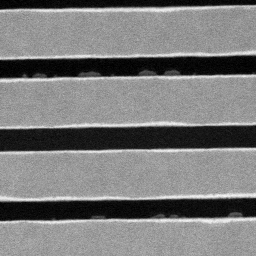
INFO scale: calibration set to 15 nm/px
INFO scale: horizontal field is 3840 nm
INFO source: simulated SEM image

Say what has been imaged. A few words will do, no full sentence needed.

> lines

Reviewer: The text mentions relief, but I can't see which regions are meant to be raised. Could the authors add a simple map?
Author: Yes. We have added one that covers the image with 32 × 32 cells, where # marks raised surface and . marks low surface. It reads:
................................
################################
################################
################################
################################
################################
################################
................................
................................
...................#############
################################
################################
################################
################################
################################
################################
................................
................................
................................
################################
################################
################################
################################
################################
################################
................................
................................
.............###################
################################
################################
################################
################################